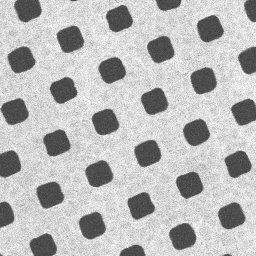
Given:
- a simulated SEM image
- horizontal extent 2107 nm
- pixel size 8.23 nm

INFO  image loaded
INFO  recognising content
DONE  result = a regular array of holes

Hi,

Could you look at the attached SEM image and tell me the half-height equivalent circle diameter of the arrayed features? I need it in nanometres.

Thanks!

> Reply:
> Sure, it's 210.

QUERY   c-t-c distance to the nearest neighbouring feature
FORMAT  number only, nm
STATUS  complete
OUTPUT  429